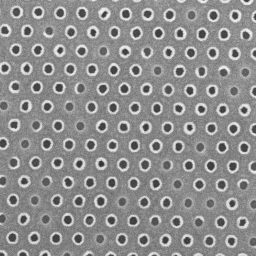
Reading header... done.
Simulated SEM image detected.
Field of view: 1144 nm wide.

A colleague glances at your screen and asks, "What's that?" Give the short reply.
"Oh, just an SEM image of a regular array of holes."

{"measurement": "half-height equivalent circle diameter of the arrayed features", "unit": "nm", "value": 35.7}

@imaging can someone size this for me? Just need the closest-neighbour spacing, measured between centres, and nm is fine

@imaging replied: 95.6